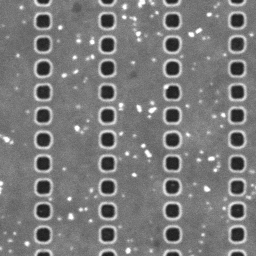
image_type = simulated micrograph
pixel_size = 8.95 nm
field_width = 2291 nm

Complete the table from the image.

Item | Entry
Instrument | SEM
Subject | a regular array of holes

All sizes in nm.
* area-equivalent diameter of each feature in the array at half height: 138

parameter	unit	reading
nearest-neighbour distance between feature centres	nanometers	210